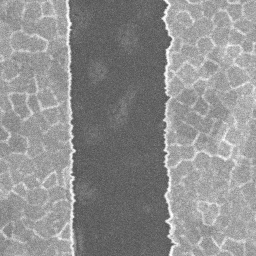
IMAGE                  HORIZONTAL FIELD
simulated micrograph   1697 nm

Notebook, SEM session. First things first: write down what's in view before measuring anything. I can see one or a few lines or trenches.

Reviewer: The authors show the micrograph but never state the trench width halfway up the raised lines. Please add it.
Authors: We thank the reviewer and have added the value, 0.64 µm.